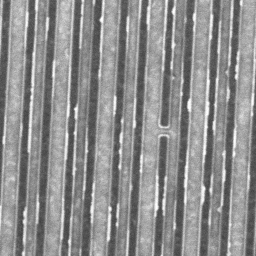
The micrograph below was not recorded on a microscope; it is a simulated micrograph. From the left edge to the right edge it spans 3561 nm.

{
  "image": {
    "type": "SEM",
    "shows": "parallel lines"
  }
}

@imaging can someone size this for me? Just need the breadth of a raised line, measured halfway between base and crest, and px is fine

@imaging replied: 10.4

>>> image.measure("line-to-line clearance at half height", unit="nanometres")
196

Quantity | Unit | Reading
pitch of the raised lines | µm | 0.316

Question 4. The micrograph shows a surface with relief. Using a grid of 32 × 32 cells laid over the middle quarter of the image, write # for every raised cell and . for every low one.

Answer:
..##...##....##...###....##...##
..##..###....##...###....##...##
.###..###....##...###....##...##
.###..###....##...###....##..###
.###..###....##...##....###..###
.###..###....##...##....###..###
.###..###....##...##....###..###
.###..###....##...##....###..###
.###..###....##...##....###..###
.##...###....##...##....###..###
.##...###....##...##....###..###
.##...###....##...##....##...###
.##...###...###...##....##...###
.##...##....###...##....##...###
.##...##....###..###....##...##.
.##...##....###..###....##...##.
.##...##....###..###.........##.
.##...##....###..###.........##.
.##...##....###..###....##...##.
.##...##....##...###....##...##.
.##..###....##...###....##...##.
###..###....##...###....##...##.
###..###....##...###....##..###.
###..###....##...##....###..###.
###..###....##...##....###..###.
###..###....##...##....###..###.
###..###....##...##....###..###.
###..###....##...##....###..###.
##...###....##...##....###..###.
##...###....##...##....###..###.
##...###....##...##....##...##..
##...###...###..###....##...##..